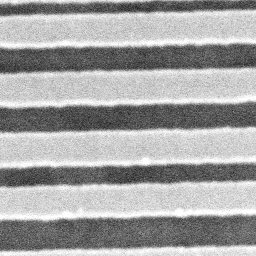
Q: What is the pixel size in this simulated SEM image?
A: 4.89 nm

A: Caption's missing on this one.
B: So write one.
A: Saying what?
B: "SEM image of lines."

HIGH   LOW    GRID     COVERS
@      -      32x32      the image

--------------------------------
------------------------@@@@@@@@
@@@@@@@@@@@@@@@@@@@@@@@@@@@@@@@@
@@@@@@@@@@@@@@@@@@@@@@@@@@@@@@@@
@@@@@@@@@@@@@@@@@@@@@@@@@@@@@@@@
@@@@@@@@@@@@@@@@@@@@------------
--------------------------------
--------------------------------
--------------------------------
@@@@@@@@@@@@@@@@@@@@@@@@@@@@@@@@
@@@@@@@@@@@@@@@@@@@@@@@@@@@@@@@@
@@@@@@@@@@@@@@@@@@@@@@@@@@@@@@@@
@@@@@@@@@@@@@@@@@@@@@@@@@@@@@@@-
--------------------------------
--------------------------------
--------------------------------
-----------@@@@@@@@@@@@@@@@@@@@@
@@@@@@@@@@@@@@@@@@@@@@@@@@@@@@@@
@@@@@@@@@@@@@@@@@@@@@@@@@@@@@@@@
@@@@@@@@@@@@@@@@@@@@@@@@@@@@@@@@
@@@@--@@-@@@------@-------------
--------------------------------
--------------------------------
@-@@@@@@@@@@@@@@@@@@@@@@@@@@@@@@
@@@@@@@@@@@@@@@@@@@@@@@@@@@@@@@@
@@@@@@@@@@@@@@@@@@@@@@@@@@@@@@@@
@@@@@@@@@@@@@@@@@@@@@@@@@@@@@@@@
--------------------------------
--------------------------------
--------------------------------
--------------------------------
----@@@@@@@@@@@@@@@@@@@@@@@@@@@@